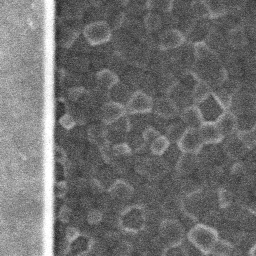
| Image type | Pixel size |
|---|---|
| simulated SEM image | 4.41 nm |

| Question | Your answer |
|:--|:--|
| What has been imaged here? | one or a few lines or trenches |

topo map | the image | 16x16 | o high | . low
ooo.............
ooo.............
ooo.............
ooo.............
ooo.............
ooo.............
ooo.............
ooo.............
ooo.............
ooo.............
ooo.............
ooo.............
ooo.............
ooo.............
ooo.............
ooo.............